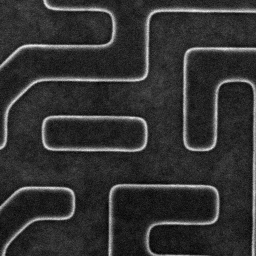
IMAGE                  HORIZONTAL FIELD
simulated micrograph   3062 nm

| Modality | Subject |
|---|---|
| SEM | wiring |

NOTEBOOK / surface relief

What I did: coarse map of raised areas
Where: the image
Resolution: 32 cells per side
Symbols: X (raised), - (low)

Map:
------XXXXXXXXXXXXXXXXXXXXXXXXXX
-------------XXXXXXX------------
--------------XXXXX-------------
--------------XXXXX-------------
--------------XXXXX-------------
-------------XXXXXX-------------
--XXXXXXXXXXXXXXXXX----XXXXXXXXX
-XXXXXXXXXXXXXXXXXX----XXXXXXXXX
XXXXXXXXXXXXXXXXXXX----XXXXXXXXX
XXXXXXXXXXXXXXXXXX-----XXXXXXXXX
XXXX-------------------XXXXX---X
XXX--------------------XXXX-----
XX---------------------XXXX-----
X----------------------XXXX-----
X----------------------XXXX-----
X----XXXXXXXXXXXXX-----XXXX-----
X----XXXXXXXXXXXXX-----XXXX-----
X----XXXXXXXXXXXXX-----XXXX-----
------XXXXXXXXXXXX-----XXXX-----
--------------------------------
--------------------------------
--------------------------------
--------------------------------
---XXXXX------XXXXXXXXXXXXX-----
-XXXXXXXX-----XXXXXXXXXXXXX-----
XXXXXXXXX-----XXXXXXXXXXXXX-----
XXXXXXXXX-----XXXXXXXXXXXXX-----
XXXXX---------XXXXXXXXXXXXX-----
XXX-----------XXXXX-------------
XX------------XXXXX-------------
X-------------XXXXX-------------
X-------------XXXXX-------------